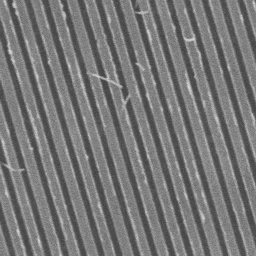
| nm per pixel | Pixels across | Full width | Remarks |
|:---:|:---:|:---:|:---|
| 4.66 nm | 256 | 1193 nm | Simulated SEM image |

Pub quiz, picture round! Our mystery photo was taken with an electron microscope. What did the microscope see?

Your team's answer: parallel lines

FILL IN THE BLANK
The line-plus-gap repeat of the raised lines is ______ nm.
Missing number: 79.5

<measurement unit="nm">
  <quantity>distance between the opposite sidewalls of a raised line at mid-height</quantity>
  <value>49.8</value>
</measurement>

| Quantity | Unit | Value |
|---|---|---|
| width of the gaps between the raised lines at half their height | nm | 31.9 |